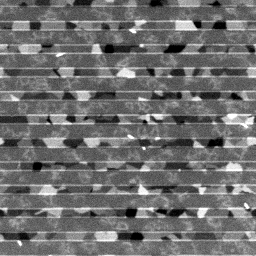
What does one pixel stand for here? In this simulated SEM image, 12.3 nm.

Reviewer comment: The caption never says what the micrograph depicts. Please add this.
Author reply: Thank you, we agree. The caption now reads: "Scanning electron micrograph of parallel lines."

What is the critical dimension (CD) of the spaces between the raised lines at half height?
179 nm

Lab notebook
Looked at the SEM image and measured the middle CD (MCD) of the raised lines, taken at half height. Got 109 nanometres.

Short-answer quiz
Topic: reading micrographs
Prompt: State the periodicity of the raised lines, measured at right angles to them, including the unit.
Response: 0.289 µm